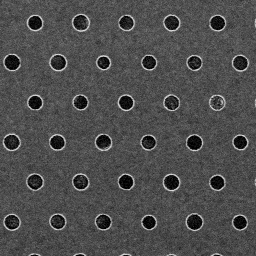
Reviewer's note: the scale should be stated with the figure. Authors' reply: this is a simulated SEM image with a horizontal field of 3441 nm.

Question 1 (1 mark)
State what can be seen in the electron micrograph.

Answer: a regular array of holes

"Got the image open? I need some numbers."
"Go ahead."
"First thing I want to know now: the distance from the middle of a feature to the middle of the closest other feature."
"611 nm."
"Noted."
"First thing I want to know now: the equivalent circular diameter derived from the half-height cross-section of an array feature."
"208 nm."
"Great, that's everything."